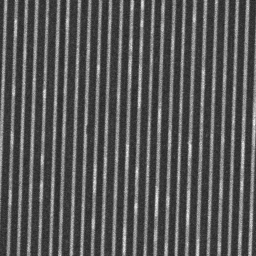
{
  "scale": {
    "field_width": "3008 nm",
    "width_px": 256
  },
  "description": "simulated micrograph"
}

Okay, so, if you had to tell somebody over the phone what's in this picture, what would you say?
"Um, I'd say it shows parallel lines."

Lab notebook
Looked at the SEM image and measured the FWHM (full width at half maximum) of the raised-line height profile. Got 2.62 px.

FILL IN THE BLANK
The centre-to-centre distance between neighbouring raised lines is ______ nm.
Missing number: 123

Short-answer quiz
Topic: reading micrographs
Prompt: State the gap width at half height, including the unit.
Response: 91 nm